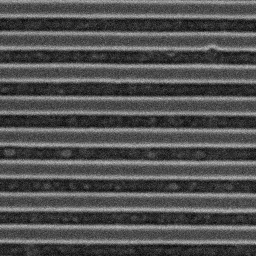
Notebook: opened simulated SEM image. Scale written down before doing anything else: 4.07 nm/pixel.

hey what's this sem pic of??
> parallel lines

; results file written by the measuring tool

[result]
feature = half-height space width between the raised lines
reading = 63.7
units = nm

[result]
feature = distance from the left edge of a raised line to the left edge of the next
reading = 0.131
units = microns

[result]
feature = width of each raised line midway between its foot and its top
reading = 67.7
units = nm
